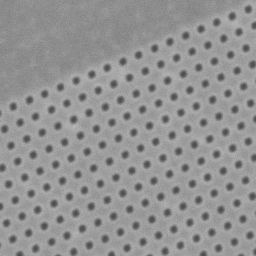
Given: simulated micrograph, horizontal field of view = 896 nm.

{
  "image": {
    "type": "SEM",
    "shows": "a regular array of holes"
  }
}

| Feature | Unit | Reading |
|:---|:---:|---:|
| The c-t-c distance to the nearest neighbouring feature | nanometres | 58.3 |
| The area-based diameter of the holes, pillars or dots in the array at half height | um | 0.0296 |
